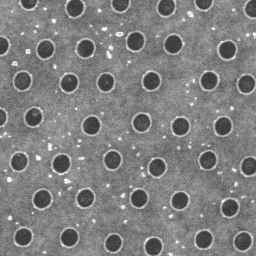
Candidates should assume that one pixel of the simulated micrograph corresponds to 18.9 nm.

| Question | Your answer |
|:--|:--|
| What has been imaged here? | a regular array of raised bodies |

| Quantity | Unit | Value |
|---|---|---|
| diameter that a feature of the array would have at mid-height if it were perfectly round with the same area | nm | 364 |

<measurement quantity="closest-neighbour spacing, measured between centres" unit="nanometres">723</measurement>